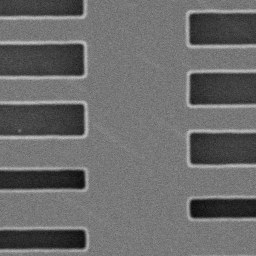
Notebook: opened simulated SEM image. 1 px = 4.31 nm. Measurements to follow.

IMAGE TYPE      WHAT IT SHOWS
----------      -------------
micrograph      groups of lines, slits or small figures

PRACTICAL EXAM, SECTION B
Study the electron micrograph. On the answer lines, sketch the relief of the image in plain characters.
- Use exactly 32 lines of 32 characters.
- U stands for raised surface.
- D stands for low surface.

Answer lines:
DDDDDDDDDDDUUUUUUUUUUUUUUUUUUUUU
DDDDDDDDDDDUUUUUUUUUUUUUUDDUUDDD
UUUUUUUUUUUUUUUUUUUUUUUUDDDDDDDD
UUUUUUUUUUUUUUUUUUUUUUUUDDDDDDDD
UUUUUUUUUUUUUUUUUUUUUUUUDDDDDDDD
DDDDDDDDDDUUUUUUUUUUUUUUDDDDDDDD
DDDDDDDDDDDUUUUUUUUUUUUUUUUUUUUU
DDDDDDDDDDDUUUUUUUUUUUUUUUUUUUUU
DDDDDDDDDDDUUUUUUUUUUUUUUUUUUUUU
DDDDDDDDDDUUUUUUUUUUUUUUDDDDDDDD
UUUUUUUUUUUUUUUUUUUUUUUUDDDDDDDD
UUUUUUUUUUUUUUUUUUUUUUUUDDDDDDDD
UUUUUUUUUUUUUUUUUUUUUUUUDDDDDDDD
DDDDDDDDDDDUUUUUUUUUUUUUUUUUUUUU
DDDDDDDDDDDUUUUUUUUUUUUUUUUUUUUU
DDDDDDDDDDDUUUUUUUUUUUUUUUUUUUUU
DDDDDDDDDDDUUUUUUUUUUUUUDDDDDDDD
UUUUUUUUUUUUUUUUUUUUUUUUDDDDDDDD
UUUUUUUUUUUUUUUUUUUUUUUUDDDDDDDD
UUUUUUUUUUUUUUUUUUUUUUUUDDDDDDDD
UUUUUUUUUUUUUUUUUUUUUUUUDDDDDDDD
DDDDDDDDDDDUUUUUUUUUUUUUUUUUUUUU
DDDDDDDDDDDUUUUUUUUUUUUUUUUUUUUU
DDDDDDDDDDUUUUUUUUUUUUUUUUUUUUUU
UUUUUUUUUUUUUUUUUUUUUUUUUUUUUUUU
UUUUUUUUUUUUUUUUUUUUUUUUDDDDDDDD
UUUUUUUUUUUUUUUUUUUUUUUUDDDDDDDD
UUUUUUUUUUUUUUUUUUUUUUUUUUUUUUUU
UUUUUUUUUUUUUUUUUUUUUUUUUUUUUUUU
DDDDDDDDDDDUUUUUUUUUUUUUUUUUUUUU
DDDDDDDDDDDUUUUUUUUUUUUUUUUUUUUU
UUUUUUUUUUUUUUUUUUUUUUUUUUUUUUUU